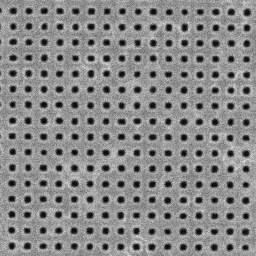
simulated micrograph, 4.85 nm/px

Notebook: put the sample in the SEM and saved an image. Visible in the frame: a regular array of holes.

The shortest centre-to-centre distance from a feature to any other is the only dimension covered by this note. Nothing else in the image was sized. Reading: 74.5 nanometers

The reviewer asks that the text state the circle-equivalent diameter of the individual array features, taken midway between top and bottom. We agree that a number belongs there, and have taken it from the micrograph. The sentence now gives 31.9 nanometres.